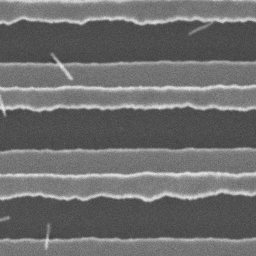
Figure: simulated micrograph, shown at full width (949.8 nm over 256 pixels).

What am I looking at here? lines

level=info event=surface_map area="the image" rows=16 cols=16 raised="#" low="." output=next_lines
################
................
................
................
################
################
################
................
................
################
################
################
.........#......
................
................
################